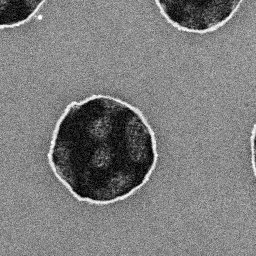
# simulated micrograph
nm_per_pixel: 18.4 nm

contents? raised bodies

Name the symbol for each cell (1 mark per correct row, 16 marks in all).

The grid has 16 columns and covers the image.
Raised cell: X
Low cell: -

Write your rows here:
XX--------XXXXX-
X----------XXX--
----------------
----------------
----------------
----------------
-----XXX--------
----XXXXX-------
---XXXXXXX------
---XXXXXXX------
---XXXXXXX------
----XXXXX-------
-----XX---------
----------------
----------------
----------------